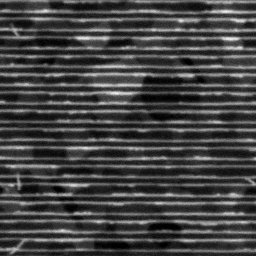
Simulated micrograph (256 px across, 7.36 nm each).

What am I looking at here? parallel lines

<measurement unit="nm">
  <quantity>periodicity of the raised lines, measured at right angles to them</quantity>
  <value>135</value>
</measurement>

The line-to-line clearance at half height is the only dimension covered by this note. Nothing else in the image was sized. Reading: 5.87 px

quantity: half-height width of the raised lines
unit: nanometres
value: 86.5